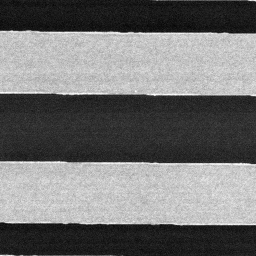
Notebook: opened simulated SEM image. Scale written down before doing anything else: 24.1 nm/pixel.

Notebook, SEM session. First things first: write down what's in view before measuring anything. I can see lines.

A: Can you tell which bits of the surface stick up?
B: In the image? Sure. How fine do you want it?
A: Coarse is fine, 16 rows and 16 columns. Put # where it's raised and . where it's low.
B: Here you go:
................
................
################
################
################
################
................
................
................
................
################
################
################
################
................
................